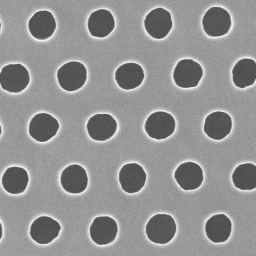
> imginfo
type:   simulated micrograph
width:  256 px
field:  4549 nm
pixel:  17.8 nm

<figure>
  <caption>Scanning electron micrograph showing a regular array of holes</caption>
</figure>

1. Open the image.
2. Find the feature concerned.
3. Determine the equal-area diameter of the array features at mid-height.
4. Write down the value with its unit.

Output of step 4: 0.508 µm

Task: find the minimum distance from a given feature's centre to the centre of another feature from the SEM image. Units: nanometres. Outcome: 1030